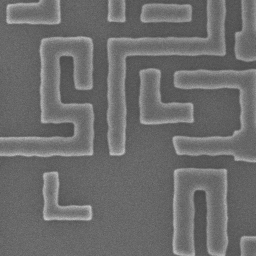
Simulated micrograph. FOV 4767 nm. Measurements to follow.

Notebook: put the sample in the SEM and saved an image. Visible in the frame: wiring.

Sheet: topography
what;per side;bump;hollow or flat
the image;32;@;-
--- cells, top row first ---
-@@@@@@-------@@--@@@-----@@--@@
-@@@@@@-------@@--@@@@@@--@@--@@
-@@@@@@-------@---@@@@@@--@@--@@
--------------------------@@--@@
--------------------------@@-@@@
-----@@@@@@@-@@@@@@@@@@@@@@@-@@@
-----@@@@@@@-@@@@@@@@@@@@@@@-@@@
-----@@--@@@--@@--------------@@
-----@@--@@@--@@----------------
-----@@--@@--@@@-@@@--@@@@@@@@@@
-----@@--@@--@@@--@@--@@@@@@@@@@
-----@@------@@@--@@----------@@
-----@@@-----@@@-@@@----------@@
-----@@@@@@@-@@@-@@@@@@@------@@
-----@@@@@@@-@@@--@@@@@@------@@
---------@@@-@@@--------------@@
---------@@@-@@@-------------@@@
@@@@@@@@@@@@-@@@------@@@@@@@@@@
@@@@@@@@@@@@--@@------@@@@@@@@@@
-----@-----------------------@@@
--------------------------------
----------------------@@@@@@----
-----@@---------------@@@@@@----
-----@@---------------@@@@@@----
-----@@---------------@@--@@----
------@---------------@@--@@----
-----@@@@@@-----------@@--@@----
----------------------@@--@@----
----------------------@@--@@----
----------------------@@--@@----
----------------------@@--@@--@@
----------------------@@--@@--@@